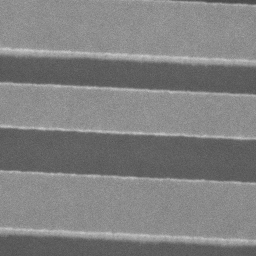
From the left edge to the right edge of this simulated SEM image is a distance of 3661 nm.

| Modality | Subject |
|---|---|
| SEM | lines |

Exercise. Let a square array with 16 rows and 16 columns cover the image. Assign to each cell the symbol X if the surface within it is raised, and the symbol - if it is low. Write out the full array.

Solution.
XXXXXXXXXXXXXXXX
XXXXXXXXXXXXXXXX
XXXXXXXXXXXXXXXX
-------XXXXXXXXX
----------------
XXXXXXX---------
XXXXXXXXXXXXXXXX
XXXXXXXXXXXXXXXX
------------XXXX
----------------
----------------
XXXXXXXXXXXXXXXX
XXXXXXXXXXXXXXXX
XXXXXXXXXXXXXXXX
----XXXXXXXXXXXX
----------------